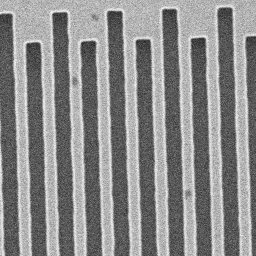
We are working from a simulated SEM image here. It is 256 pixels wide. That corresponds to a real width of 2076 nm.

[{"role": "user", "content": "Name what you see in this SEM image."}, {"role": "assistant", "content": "groups of lines, slits or small figures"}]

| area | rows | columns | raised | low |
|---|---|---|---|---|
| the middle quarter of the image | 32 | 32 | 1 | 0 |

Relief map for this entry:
01110000111000011100001110000111
01110000011000011100001110000111
01110000011000011100001110000111
00110000011000011100001110000111
00110000011000011100001110000111
00110000011000011100001110000111
00110000011000011100001110000111
00110000011000001100001110000111
00110000011000001100001110000111
00110000011000001100001110000111
00110000011000001100001110000111
00110000011000001100001110000111
00110000011000001100001110000111
00110000011000001100001110000111
00111000011000001100001110000111
00111000011000001100000110000111
00111000011000001100000110000111
00111000011000001100000110000111
00111000011000001100000110000011
00111000011000001100000110000011
00111000011100001100000110000011
00111000011100001100000110000011
00111000011100001100000110000011
00111000011100001100000110000011
00111000011100001100000111000011
00111000011100001100000111000011
00111000011100001100000111000011
00111000011100001100000111000011
00111000011100001100000111000011
00111000011100001100000111000011
00111000011100001110000111000011
00111000011100001110000111000011